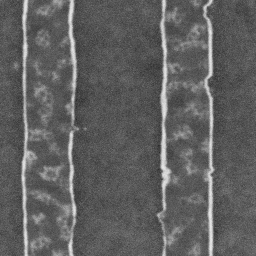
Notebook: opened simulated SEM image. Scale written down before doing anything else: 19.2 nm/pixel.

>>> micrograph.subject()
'one or a few lines or trenches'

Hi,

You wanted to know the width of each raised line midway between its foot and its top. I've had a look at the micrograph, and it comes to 900 nanometres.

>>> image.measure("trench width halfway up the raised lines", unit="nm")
1750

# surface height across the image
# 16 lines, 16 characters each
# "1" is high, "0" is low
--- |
0011000000111000
0011000000111000
0011000000111000
0011100000111000
0011100000111000
0011100000111000
0011100000111000
0011100000111000
0011100000111000
0011000000111000
0011000000111000
0111000000111000
0011100000111000
0011100000111000
0011100000111000
0011000000111000